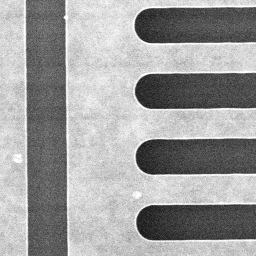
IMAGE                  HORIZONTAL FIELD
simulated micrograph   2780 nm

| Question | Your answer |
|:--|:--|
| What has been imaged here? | groups of lines, slits or small figures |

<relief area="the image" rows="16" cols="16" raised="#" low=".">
##..######......
##..####........
##..#####.......
##..############
##..############
##..####........
##..#####.......
##..############
##..############
##..#####.......
##..#####.......
##..############
##..############
##..#####.......
##..#####.......
##..############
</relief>